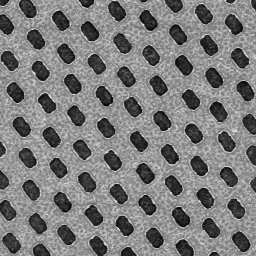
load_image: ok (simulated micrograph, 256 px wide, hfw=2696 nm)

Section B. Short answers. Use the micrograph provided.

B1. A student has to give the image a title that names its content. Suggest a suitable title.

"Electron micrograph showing a regular array of holes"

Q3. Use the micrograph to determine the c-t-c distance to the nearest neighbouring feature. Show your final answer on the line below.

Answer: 328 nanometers